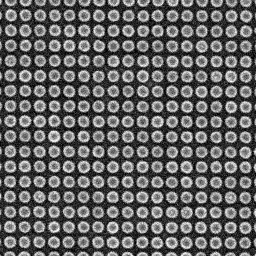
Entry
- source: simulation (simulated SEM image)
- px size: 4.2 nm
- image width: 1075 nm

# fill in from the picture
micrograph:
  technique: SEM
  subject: a regular array of raised bodies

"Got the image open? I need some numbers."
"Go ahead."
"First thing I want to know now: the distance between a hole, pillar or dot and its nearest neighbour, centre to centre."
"0.0611 microns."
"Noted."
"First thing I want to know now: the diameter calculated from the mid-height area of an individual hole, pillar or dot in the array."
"45.9 nm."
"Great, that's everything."